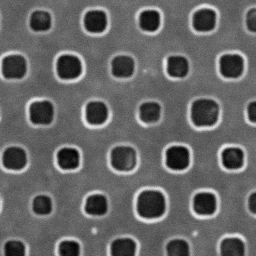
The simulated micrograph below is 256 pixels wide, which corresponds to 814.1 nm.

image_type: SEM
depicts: a regular array of holes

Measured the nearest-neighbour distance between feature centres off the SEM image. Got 169 nm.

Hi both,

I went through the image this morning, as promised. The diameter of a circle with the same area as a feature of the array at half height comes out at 79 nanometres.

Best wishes